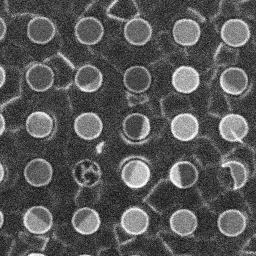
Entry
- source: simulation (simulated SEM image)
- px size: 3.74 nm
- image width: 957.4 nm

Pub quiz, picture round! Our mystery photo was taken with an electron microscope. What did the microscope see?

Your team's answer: a regular array of raised bodies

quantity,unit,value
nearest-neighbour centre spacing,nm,178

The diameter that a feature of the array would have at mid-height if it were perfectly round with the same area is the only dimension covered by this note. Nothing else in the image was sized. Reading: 99.8 nanometers